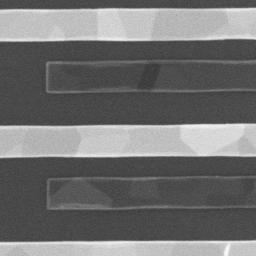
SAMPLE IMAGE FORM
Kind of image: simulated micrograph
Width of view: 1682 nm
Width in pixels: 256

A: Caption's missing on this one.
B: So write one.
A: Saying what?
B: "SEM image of wiring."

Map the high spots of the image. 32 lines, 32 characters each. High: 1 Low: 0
00000000000000000000000000000000
11111111111111111111111111111111
11111111111111111111111111111111
11111111111111111111111111111111
11111111111111111111111111111111
00000000000000000000000000000000
00000000000000000000000000000000
00000000000000000000000000000000
00000011111111111111111111111111
00000011111111111111111111111111
00000011111111111111111111111111
00000011100000000000000000000000
00000000000000000000000000000000
00000000000000000000000000000000
00000000000000000000000000000000
00000000000000000000000000000000
11111111111111111111111111111111
11111111111111111111111111111111
11111111111111111111111111111111
11111111111111000000000110000000
00000000000000000000000000000000
00000000000000000000000000000000
00000011111111111111111111111111
00000011111111111111111111111111
00000011111111111111111111111111
00000011111111111111111111111111
00000000000000000000000000000000
00000000000000000000000000000000
00000000000000000000000000000000
00000000000000000000000000000000
11111111111111111111111111111111
11111111111111111111111111111111